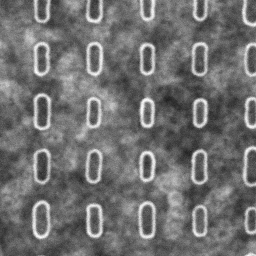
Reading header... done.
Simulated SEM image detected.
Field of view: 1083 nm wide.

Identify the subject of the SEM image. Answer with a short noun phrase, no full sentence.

a regular array of raised bodies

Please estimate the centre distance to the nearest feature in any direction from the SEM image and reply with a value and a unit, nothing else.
222 nm